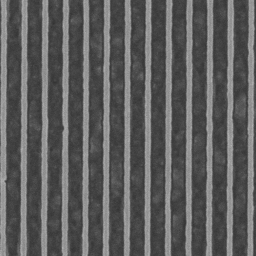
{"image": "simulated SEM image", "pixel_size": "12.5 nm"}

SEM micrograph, parallel lines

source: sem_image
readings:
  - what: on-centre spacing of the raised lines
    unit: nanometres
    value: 258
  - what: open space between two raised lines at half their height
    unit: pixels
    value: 15.2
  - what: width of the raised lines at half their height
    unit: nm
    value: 64.1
